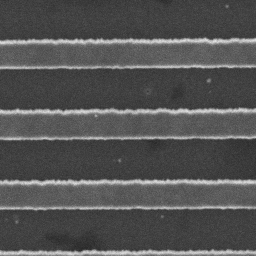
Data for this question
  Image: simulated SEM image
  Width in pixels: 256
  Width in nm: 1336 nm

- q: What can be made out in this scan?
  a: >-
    lines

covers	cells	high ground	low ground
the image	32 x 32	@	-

--------------------------------
--------------------------------
--------------------------------
--------------------------------
--------------------------------
@@@@@@@@@@@@@@@@@@@@@@@@@@@@@@@@
@@@@@@@@@@@@@@@@@@@@@@@@@@@@@@@@
@@@@@@@@@@@@@@@@@@@@@@@@@@@@@@@@
@@@@@@@@@@@@--@@@---------------
--------------------------------
--------------------------------
--------------------------------
--------------------------------
--------------------------------
@@@@@@@@@@@@@@@@@@@@@@@@@@@@@@@@
@@@@@@@@@@@@@@@@@@@@@@@@@@@@@@@@
@@@@@@@@@@@@@@@@@@@@@@@@@@@@@@@@
--------------------------------
--------------------------------
--------------------------------
--------------------------------
--------------------------------
--------------------------------
@@@@@@@@@@@@@@@@@@@@@@@@@@@@@@@@
@@@@@@@@@@@@@@@@@@@@@@@@@@@@@@@@
@@@@@@@@@@@@@@@@@@@@@@@@@@@@@@@@
--------------------------------
--------------------------------
--------------------------------
--------------------------------
--------------------------------
--@@@@-@--@@@@@@-@@@@@@@@@@@@@@@